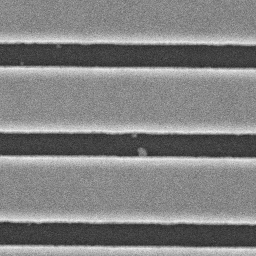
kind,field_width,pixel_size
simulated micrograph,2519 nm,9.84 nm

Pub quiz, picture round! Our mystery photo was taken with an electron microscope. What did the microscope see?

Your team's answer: lines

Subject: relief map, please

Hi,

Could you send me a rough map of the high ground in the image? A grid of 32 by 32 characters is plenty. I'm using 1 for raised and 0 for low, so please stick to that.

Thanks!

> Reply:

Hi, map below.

11111111111111111111111111111111
11111111111111111111111111111111
11111111111111111111111111111111
11111111111111111111111111111111
11111111111111111111111111111111
00000000000000000000000000010011
00000000000000000000000000000000
00000000000000000000000000000000
11111110000000000000000000000000
11111111111111111111111111111111
11111111111111111111111111111111
11111111111111111111111111111111
11111111111111111111111111111111
11111111111111111111111111111111
11111111111111111111111111111111
11111111111111111111111111111111
11111111111111111111111111111111
00000000000000000000000000000000
00000000000000000000000000000000
00000000000000000000000000000000
11111111111111111111111111111111
11111111111111111111111111111111
11111111111111111111111111111111
11111111111111111111111111111111
11111111111111111111111111111111
11111111111111111111111111111111
11111111111111111111111111111111
11111111111111111111111111111111
00000000000000000000000000000000
00000000000000000000000000000000
00000000000000000000000000000000
11111111111111111111111111111111